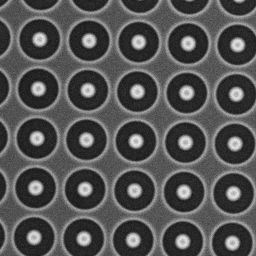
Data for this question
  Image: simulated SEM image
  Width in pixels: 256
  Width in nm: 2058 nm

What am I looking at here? an array of small figures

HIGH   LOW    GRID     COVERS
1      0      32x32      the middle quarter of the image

11111111111111111111111111111111
11111001111111111111111111111111
11100000011111110000011111111000
11000000001111000000001111100000
10000000000111000000000111000000
10000110000110000000000111000000
10000111000110000111000011000111
10000110000110000111000011000111
10000000000110000000000111000011
11000000001111000000000111000000
11100000011111000000001111100000
11110001111111110000011111110000
11111111111111111111111111111101
11111111111111111111111111111111
11100000111111110000111111111101
11000000011111000000001111100000
10000000001111000000001111000000
10000000000110000000000111000000
00001110000110000110000110000110
00001110000110000110000110000111
10000100000110000110000110000111
10000000001110000000000111000000
11000000011111000000001111000000
11100000111111100000011111100000
11111111111111111001111111111000
11111111111111111111111111111111
11110001111111111011111111111111
11000000011111100000011111110000
10000000001111000000001111000000
00000000001110000000001111000000
00001110001110000110000110000010
00001110000100001110000110000110